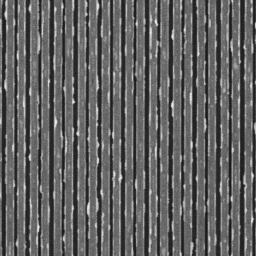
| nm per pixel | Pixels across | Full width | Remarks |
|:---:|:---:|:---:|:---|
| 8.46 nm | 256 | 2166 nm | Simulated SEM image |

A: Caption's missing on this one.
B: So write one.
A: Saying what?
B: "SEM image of parallel lines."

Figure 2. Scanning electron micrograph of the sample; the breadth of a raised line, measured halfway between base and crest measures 67.7 nanometres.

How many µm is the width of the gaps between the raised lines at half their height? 0.0307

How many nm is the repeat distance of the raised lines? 101